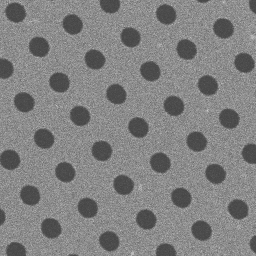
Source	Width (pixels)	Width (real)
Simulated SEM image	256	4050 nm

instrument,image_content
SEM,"a regular array of holes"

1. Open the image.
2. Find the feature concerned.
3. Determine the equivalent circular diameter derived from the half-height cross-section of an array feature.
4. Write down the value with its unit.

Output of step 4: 329 nm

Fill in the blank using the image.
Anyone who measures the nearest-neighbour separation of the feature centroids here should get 630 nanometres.